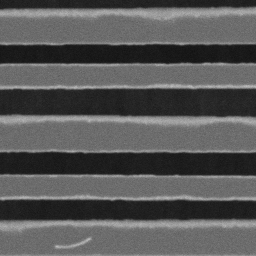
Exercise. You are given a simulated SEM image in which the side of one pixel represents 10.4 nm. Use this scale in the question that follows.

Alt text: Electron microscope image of lines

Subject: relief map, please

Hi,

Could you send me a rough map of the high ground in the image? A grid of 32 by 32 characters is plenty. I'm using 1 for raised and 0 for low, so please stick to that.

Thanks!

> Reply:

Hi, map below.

00000000000000000000000000000000
11111111111111111111111111111111
11111111111111111111111111111111
11111111111111111111111111111111
11111111111111111111111111111111
11111111000001111100001101101000
00000000000000000000000000000000
00000000000000000000000000000000
11111111111111111111111111111111
11111111111111111111111111111111
11111111111111111111111111111111
00000000000000000000000000000000
00000000000000000000000000000000
00000000000000000000000000000000
00100110000000000000000000000000
11111111111111111111111111111111
11111111111111111111111111111111
11111111111111111111111111111111
11111111111111111111111111111111
00000000000000000000000000000000
00000000000000000000000000000000
00000000000000000000000000000000
11111111111111111111111111111111
11111111111111111111111111111111
11111111111111111111111111111111
00000000000000000000000000000000
00000000000000000000000000000000
00000000000000000000000000000000
11111111111111111111111111111111
11111111111111111111111111111111
11111111111111111111111111111111
11111111111111111111111111111111